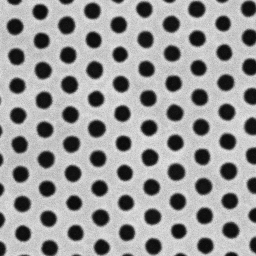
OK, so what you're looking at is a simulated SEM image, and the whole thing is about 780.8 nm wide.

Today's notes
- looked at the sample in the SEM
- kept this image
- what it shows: a regular array of holes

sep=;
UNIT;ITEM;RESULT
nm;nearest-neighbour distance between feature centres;89.5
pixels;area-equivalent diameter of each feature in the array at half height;16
